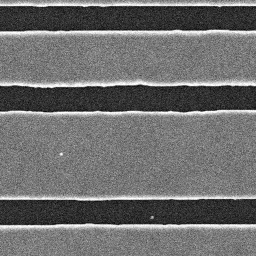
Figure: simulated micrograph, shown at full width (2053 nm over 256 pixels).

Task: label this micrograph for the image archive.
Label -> lines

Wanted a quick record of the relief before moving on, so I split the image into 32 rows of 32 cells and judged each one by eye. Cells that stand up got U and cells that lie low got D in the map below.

UUUUUUUUUUUUUUUUUUUUUUUUUUUUUUUU
DDDDDDDDDDDDDDDDDDDDDDDDDDDDDDDD
DDDDDDDDDDDDDDDDDDDDDDDDDDDDDDDD
DDDDDDDDDDDDDDDDDDDDDDDDDDDDDDDD
UUUUUUUUUUUUUUUUUUUUUUUUUUUUUUUU
UUUUUUUUUUUUUUUUUUUUUUUUUUUUUUUU
UUUUUUUUUUUUUUUUUUUUUUUUUUUUUUUU
UUUUUUUUUUUUUUUUUUUUUUUUUUUUUUUU
UUUUUUUUUUUUUUUUUUUUUUUUUUUUUUUU
UUUUUUUUUUUUUUUUUUUUUUUUUUUUUUUU
UUUUUUUUUUUUUUUUUUUUUUUUUUUUUUUU
DDDDDDDDDDDDDDDDDDDDDDDDDDDDDDDD
DDDDDDDDDDDDDDDDDDDDDDDDDDDDDDDD
DDDDDDDDDDDDDDDDDDDDDDDDDDDDDDDD
UUUUUUUUUUUUUUUUUUUUUUUUUUUUUUUU
UUUUUUUUUUUUUUUUUUUUUUUUUUUUUUUU
UUUUUUUUUUUUUUUUUUUUUUUUUUUUUUUU
UUUUUUUUUUUUUUUUUUUUUUUUUUUUUUUU
UUUUUUUUUUUUUUUUUUUUUUUUUUUUUUUU
UUUUUUUUUUUUUUUUUUUUUUUUUUUUUUUU
UUUUUUUUUUUUUUUUUUUUUUUUUUUUUUUU
UUUUUUUUUUUUUUUUUUUUUUUUUUUUUUUU
UUUUUUUUUUUUUUUUUUUUUUUUUUUUUUUU
UUUUUUUUUUUUUUUUUUUUUUUUUUUUUUUU
UUUUUUUUUUUUUUUUUUUUUUUUUUUUUUUU
DDDDDDDDDDDDDDDDDDDDDDDDDDDDDDDD
DDDDDDDDDDDDDDDDDDDDDDDDDDDDDDDD
DDDDDDDDDDDDDDDDDDDDDDDDDDDDDDDD
UUUUUUUUUUUUUUUUUUUUUUUUUUUUUUUU
UUUUUUUUUUUUUUUUUUUUUUUUUUUUUUUU
UUUUUUUUUUUUUUUUUUUUUUUUUUUUUUUU
UUUUUUUUUUUUUUUUUUUUUUUUUUUUUUUU